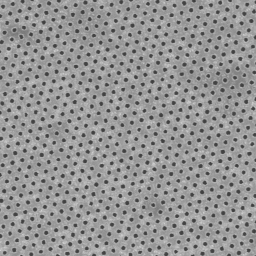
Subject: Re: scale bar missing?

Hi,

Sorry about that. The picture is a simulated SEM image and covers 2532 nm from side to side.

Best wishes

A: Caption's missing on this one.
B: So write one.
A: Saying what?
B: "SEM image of a regular array of holes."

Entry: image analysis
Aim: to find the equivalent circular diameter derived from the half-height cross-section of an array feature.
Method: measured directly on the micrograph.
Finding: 4.22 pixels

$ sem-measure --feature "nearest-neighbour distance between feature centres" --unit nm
95.7